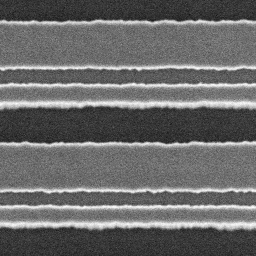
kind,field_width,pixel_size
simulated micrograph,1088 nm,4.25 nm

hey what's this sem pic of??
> lines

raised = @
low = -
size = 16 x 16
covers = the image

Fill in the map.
----------------
@@@@@@@@@@@@@@@@
@@@@@@@@@@@@@@@@
@@@@@@@@@@@@@@@@
@@@@@@@@@@@@@@@@
@@@@@@@@@@@@@@@@
@@@@@@@@@@@@@@@@
----------------
----------------
@@@@@@@@@@@@@@@@
@@@@@@@@@@@@@@@@
@@@@@@@@@@@@@@@@
@@@@@@@@@@@@@@@@
@@@@@@@@@@@@@@@@
----------------
----------------